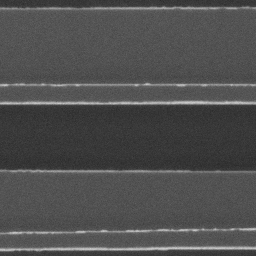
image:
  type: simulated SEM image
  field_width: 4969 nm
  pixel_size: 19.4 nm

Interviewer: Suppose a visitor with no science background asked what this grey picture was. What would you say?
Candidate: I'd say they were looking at lines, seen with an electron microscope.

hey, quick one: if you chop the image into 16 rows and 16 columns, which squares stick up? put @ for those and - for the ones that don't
----------------
@@@@@@@@@@@@@@@@
@@@@@@@@@@@@@@@@
@@@@@@@@@@@@@@@@
@@@@@@@@@@@@@@@@
@@@@@@@@@@@@@@@@
----------------
----------------
----------------
----------------
----------------
@@@@@@@@@@@@@@@@
@@@@@@@@@@@@@@@@
@@@@@@@@@@@@@@@@
@@@@@@@@@@@@@@@@
@@@@@@@@@@@@@@@@